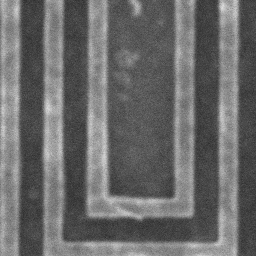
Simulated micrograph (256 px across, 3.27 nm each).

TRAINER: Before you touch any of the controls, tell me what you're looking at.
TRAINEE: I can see groups of lines, slits or small figures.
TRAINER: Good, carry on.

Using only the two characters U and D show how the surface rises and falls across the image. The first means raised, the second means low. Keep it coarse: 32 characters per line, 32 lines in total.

UUDDDDUUDDDUUDDDDDDDDDUUDDDDUUDD
UUDDDDUUDDDUUDDDDDDDDDUUDDDDUUDD
UUDDDDUUDDDUUDDDDDDDDDUUDDDDUUDD
UUDDDDUUDDDUUDDDDDDDDDUUDDDDUUDD
UUDDDDUUDDDUUDDDDDDDDDUUDDDDUUDD
UUDDDDUUDDDUUDDDDDDDDDUUDDDDUUDD
UUDDDDUUDDDUUDDDDDDDDDUUDDDDUUDD
UUDDDDUUDDDUUDDDDDDDDDUUDDDDUUDD
UUDDDDUUDDDUUDDDDDDDDDUUDDDDUUDD
UUDDDDUUDDDUUDDDDDDDDDUUDDDDUUDD
UUDDDDUUDDDUUDDDDDDDDDUUDDDDUUDD
UUDDDDUUDDDUUDDDDDDDDDUUDDDDUUDD
UUDDDDUUDDDUUDDDDDDDDDUUDDDDUUDD
UUDDDDUUDDDUUDDDDDDDDDUUDDDDUUDD
UUDDDDUUDDDUUDDDDDDDDDUUDDDDUUDD
UUDDDDUUDDDUUDDDDDDDDDUUDDDDUUDD
UUDDDDUUDDDUUDDDDDDDDDUUDDDDUUDD
UUDDDDUUDDDUUDDDDDDDDDUUDDDDUUDD
UUDDDDUUDDDUUDDDDDDDDDUUDDDDUUDD
UUDDDDUUDDDUUDDDDDDDDDUUDDDDUUDD
UUDDDDUUDDDUUDDDDDDDDDUUDDDDUUDD
UUDDDDUUDDDUUDDDDDDDDDUUDDDDUUDD
UUDDDDUUDDDUUDDDDDDDDDUUDDDDUUDD
UUDDDDUUDDDUUDDDDDDDDDUUDDDDUUDD
UUDDDDUUDDDUUDDDDDDDDDUUDDDDUUDD
UUDDDDUUDDDUUUUUUUUUUUUUDDDDUUDD
UUDDDDUUDDDUUUUUUUUUUUUUDDDDUUDD
UUDDDDUUDDDDDDDDDDDDDDDDDDDDUUDD
UUDDDDUUDDDDDDDDDDDDDDDDDDDDUUDD
UUDDDDUUDDDDDDDDDDDDDDDDDDDUUUDD
UUDDDDUUUUUUUUUUUUUUUUUUUUUUUUDD
UUDDDDUUUUUUUUUUUUUUUUUUUUUUUDDD